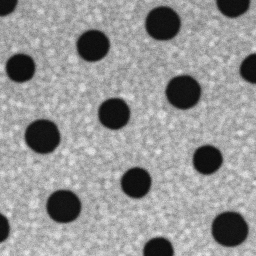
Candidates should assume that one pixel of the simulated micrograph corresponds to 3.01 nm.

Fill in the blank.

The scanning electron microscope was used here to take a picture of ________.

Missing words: a regular array of holes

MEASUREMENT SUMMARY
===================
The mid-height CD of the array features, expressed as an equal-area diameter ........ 100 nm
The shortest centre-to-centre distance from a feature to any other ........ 216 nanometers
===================